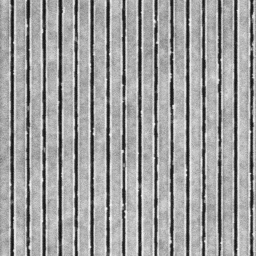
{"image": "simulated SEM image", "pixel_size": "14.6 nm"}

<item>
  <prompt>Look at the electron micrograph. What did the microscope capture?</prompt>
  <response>parallel lines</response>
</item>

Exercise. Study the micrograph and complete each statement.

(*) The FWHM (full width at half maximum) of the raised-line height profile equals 0.084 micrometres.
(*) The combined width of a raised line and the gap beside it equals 234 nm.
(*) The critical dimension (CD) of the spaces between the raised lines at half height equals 0.153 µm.